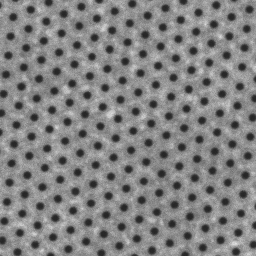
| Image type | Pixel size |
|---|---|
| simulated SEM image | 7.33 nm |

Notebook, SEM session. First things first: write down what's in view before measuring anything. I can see a regular array of holes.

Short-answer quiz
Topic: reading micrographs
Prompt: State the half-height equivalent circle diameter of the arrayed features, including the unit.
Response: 60.2 nm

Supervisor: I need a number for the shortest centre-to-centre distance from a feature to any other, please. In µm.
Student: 0.14